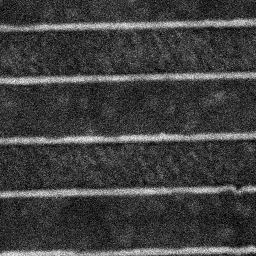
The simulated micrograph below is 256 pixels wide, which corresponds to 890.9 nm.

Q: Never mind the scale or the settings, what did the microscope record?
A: one or a few lines or trenches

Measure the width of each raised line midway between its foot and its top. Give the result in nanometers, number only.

225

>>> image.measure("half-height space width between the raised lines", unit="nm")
170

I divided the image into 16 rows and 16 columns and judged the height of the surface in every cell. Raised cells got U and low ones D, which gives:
UUUUUUUUUUUUUUUU
UUUUUUUUUUUUUUUU
DDDDDDDDDDDDDDDD
DDDDDDDDDDDDDDDD
DDDDDDDDDDDDDDDD
UUUUUUUUUUUUUUUU
UUUUUUUUUUUUUUUU
UUUUUUUUUUUUUUUU
UUUUUUUUUUUUUUUU
DDDDDDDDDDDDDDDD
DDDDDDDDDDDDDDDD
DDDDDDDDDDDDDDDD
UUUUUUUUUUUUUUUU
UUUUUUUUUUUUUUUU
UUUUUUUUUUUUUUUU
UUUUUUUUUUUUUUUU